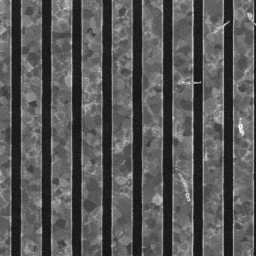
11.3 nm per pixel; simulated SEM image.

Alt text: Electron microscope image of parallel lines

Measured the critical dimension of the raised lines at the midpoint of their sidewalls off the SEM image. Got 0.227 um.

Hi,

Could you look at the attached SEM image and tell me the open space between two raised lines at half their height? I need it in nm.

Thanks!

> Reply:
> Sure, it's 114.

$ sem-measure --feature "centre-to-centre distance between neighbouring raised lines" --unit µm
0.342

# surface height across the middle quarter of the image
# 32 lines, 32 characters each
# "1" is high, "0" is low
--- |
11000111100011111000111100011111
11000111100011111000111100011111
11000111100011111000111100011111
11000111100011111000111100011111
11000111100011111000111100011111
11000111100011111000111100011111
11000111100011111000111100011111
11000111100011111000111100011111
11000111100011111000111100011111
11000111100011111000111100011111
11000111100011111000111100011111
11000111100011111000111100011111
11000111100011111000111100011111
11000111100011111000111100011111
11000111100011111000111100011111
11000111100011111000111100011111
11000111100011111000111100011111
11000111100011111000111100011111
11000111100011111000111100011111
11000111100011111000111100011111
11000111100011111000111100011111
11000111100011111000111100011111
11000111100011111000111100011111
11000111100011111000111100011111
11000111100011111000111100011111
11000111100011111000111100011111
11000111100011111000111100011111
11000111100011111000111100011111
11000111100011111000111100011111
11000111100011111000111100011111
11000111100011111000111100011111
11000111100011111000111100011111